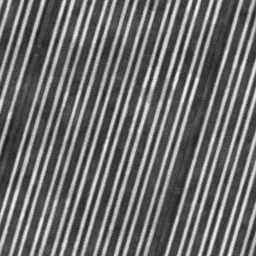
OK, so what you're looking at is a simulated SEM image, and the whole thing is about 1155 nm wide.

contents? parallel lines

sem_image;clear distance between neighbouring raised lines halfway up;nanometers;27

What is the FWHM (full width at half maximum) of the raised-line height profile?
0.0119 micrometres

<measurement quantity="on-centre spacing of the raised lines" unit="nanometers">45.4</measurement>